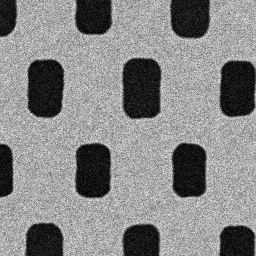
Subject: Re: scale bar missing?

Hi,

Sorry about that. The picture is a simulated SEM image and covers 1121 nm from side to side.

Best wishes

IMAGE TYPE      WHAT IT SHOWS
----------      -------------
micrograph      holes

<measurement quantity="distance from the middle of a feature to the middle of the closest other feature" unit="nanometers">418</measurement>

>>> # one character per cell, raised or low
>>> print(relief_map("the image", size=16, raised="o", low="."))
.oooo..oooo..ooo
.oooo..oooo..ooo
oooooooooooooooo
oooooooooooooooo
oo..oooo..oooo..
oo..oooo..oooo..
oo..oooo..oooo..
oooooooooooooooo
oooooooooooooooo
.oooo..oooo..ooo
.oooo..oooo..ooo
.oooo..oooo..ooo
oooooooooooooooo
oooooooooooooooo
oo..oooo..oooo..
oo..oooo..oooo..